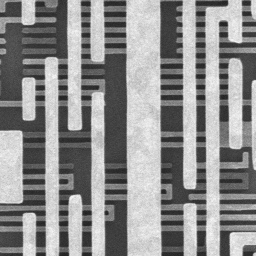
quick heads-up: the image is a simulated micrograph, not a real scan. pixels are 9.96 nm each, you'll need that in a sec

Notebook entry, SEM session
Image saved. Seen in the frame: wiring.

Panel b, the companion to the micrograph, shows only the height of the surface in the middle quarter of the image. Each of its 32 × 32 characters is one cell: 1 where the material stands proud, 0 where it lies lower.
01110000000000001111111100000011
01110000000000001111111100000011
01110000000000001111111100000011
01110000000000001111111100000011
01110000000000001111111100000011
01110000000000001111111100000011
01110000000000001111111100000011
01110001110000001111111100000011
01110001110000001111111100000011
01110001110000001111111100000011
01110001110000001111111100000011
01110001110000001111111100000011
01110001110000001111111100000011
01110001110000001111111100000011
01110001110000001111111100000011
01110001110000001111111100000011
00000001110000001111111100000011
00000001110000001111111100000011
00000001110000001111111100000011
00000001110000001111111100000011
00000001110000001111111100000011
00000001110000001111111100000011
00000001110000001111111100000011
00000001110000001111111100000011
00000001110000001111111100000011
00000001110000001111111100000011
00000001110000001111111100000011
00000001110000001111111100000011
00000001110000001111111100000011
00000001110000001111111100000011
00000001110000001111111100000011
00000001110000001111111100000000